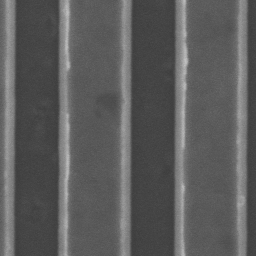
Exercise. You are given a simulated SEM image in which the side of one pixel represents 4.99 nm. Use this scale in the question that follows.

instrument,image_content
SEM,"one or a few lines or trenches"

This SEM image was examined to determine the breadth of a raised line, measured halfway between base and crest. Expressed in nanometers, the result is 321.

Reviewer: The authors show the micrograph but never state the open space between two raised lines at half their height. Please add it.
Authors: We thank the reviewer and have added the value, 259 nm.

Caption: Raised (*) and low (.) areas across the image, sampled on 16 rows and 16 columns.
*...****...****.
*...****...****.
*...****...****.
*...****...****.
*...****...****.
*...****...****.
*...****...****.
*...****...****.
*...****...****.
*...****...****.
*...****...****.
*...****...****.
*...****...****.
*...****...****.
*...****...****.
*...****...****.